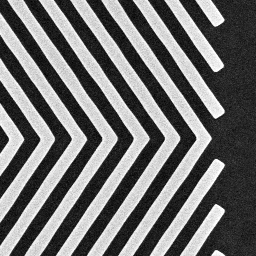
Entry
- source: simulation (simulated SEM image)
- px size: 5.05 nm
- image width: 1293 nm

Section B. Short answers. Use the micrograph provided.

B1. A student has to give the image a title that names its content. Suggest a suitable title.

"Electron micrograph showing groups of lines, slits or small figures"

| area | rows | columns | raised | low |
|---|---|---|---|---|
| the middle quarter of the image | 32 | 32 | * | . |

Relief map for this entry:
*....****....****....****...****
**....****....***....****....***
***...****....****....****....**
***....****....****....****...**
****....***.....****....***....*
.***.....***....****....****....
.****.....***....****....****...
..****....****....****....***...
...***.....***....****.....***..
...****....****....****....****.
....****....****....***.....***.
*....****....***....****....****
*.....***....****....****....***
**....****....****....***.....**
***....****....****....***....**
***.....***....****....****....*
.***....****....****....****....
.****....****....****....***....
..****....***....****....****...
..***....****....****....****...
.****....***.....***....****....
****....****....***....****....*
***....****....****....****....*
***....***.....***....****....**
**....****....***.....***....***
*....****....****....****....***
*....***.....***....****....****
....****....***.....***....****.
...****....****....****....***..
...***....****....****....****..
..***.....***.....***....****...
.****....****....****....***....